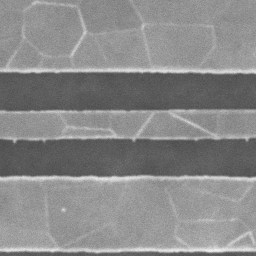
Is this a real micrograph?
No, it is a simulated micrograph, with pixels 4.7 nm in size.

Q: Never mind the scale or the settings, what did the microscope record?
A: lines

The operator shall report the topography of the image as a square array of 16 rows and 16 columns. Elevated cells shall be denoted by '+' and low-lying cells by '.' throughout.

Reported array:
++++++++++++++++
++++++++++++++++
++++++++++++++++
++++++++++++++++
.+..........++++
................
................
++++++++++++++++
++++++++++++++++
................
................
++++++++++++++++
++++++++++++++++
++++++++++++++++
++++++++++++++++
++++++++++++++++